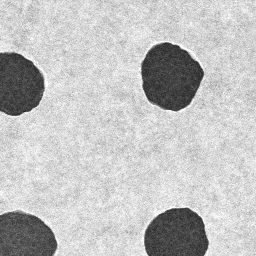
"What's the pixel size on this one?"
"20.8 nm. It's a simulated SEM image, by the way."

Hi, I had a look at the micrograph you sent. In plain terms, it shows holes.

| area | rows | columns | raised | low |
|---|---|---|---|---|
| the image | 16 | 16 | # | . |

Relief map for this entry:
################
################
################
.########...####
...######....###
...######...####
..########..####
################
################
################
################
################
################
..########..####
...######....###
....#####....###